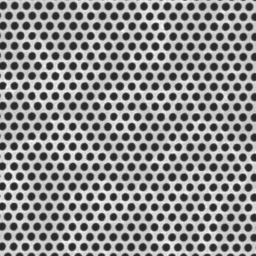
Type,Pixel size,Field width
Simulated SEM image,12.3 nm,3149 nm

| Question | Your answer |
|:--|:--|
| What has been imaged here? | a regular array of holes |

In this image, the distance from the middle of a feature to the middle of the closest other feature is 139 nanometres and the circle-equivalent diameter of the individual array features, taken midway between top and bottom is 101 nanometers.